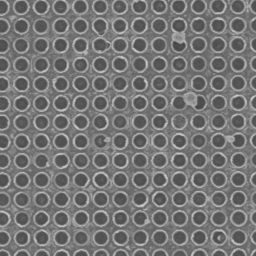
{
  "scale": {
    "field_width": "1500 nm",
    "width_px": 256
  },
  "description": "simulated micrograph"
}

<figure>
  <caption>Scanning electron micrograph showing a regular array of holes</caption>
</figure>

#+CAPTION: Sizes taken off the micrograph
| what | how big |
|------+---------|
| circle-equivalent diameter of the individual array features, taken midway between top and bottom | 77.3 nm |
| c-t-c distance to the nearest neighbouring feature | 111 nm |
